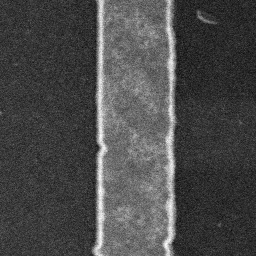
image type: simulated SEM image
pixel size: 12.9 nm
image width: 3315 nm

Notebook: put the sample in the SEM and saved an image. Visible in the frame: one or a few lines or trenches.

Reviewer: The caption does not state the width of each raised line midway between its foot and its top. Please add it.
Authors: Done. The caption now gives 0.903 µm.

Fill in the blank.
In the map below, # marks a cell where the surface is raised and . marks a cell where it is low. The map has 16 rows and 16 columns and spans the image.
......#####.....
......#####.....
......#####.....
......#####.....
......#####.....
......#####.....
......#####.....
......#####.....
......#####.....
......#####.....
......#####.....
......#####.....
......#####.....
......#####.....
......#####.....
......####......